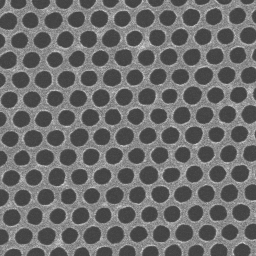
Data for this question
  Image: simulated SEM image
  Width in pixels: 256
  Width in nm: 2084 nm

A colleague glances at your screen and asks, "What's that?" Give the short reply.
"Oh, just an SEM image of a regular array of holes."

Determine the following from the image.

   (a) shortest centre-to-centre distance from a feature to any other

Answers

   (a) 182 nanometres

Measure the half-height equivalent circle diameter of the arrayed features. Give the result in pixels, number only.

16.7